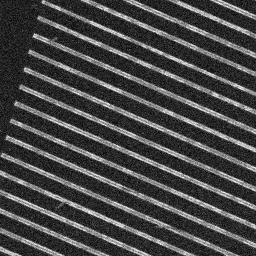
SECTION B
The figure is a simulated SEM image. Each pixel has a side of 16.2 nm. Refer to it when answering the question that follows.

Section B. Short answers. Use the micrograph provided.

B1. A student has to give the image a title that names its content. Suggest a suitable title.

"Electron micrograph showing parallel lines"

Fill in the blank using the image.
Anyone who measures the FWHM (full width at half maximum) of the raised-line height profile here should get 0.0651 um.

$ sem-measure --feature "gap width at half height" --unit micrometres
0.225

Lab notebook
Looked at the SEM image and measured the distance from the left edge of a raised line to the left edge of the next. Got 283 nanometers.